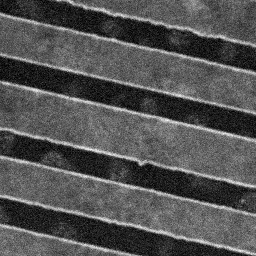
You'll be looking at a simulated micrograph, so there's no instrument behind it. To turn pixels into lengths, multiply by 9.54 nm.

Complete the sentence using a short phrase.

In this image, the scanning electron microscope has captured one or a few lines or trenches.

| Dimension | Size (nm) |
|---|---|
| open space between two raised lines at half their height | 258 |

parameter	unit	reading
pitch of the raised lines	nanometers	658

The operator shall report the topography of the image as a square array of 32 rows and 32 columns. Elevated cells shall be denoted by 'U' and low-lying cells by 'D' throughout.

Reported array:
DDDDDDDDDUUUUUUUUUUUUUUUUUUUUUUU
DDDDDDDDDDDDDUUUUUUUUUUUUUUUUUUU
UUUDDDDDDDDDDDDDDDUUUUUUUUUUUUUU
UUUUUUUDDDDDDDDDDDDDDDUUUUUUUUUU
UUUUUUUUUUUUDDDDDDDDDDDDDDUUUUUU
UUUUUUUUUUUUUUUUDDDDDDDDDDDDDDDU
UUUUUUUUUUUUUUUUUUUUUDDDDDDDDDDD
DDDUUUUUUUUUUUUUUUUUUUUUUDDDDDDD
DDDDDDDUUUUUUUUUUUUUUUUUUUUUUDDD
DDDDDDDDDDDDUUUUUUUUUUUUUUUUUUUU
UDDDDDDDDDDDDDDDUUUUUUUUUUUUUUUU
UUUUUUDDDDDDDDDDDDDDUUUUUUUUUUUU
UUUUUUUUUUDDDDDDDDDDDDDDDUUUUUUU
UUUUUUUUUUUUUUDDDDDDDDDDDDDDDUUU
UUUUUUUUUUUUUUUUUUUDDDDDDDDDDDDD
UUUUUUUUUUUUUUUUUUUUUUUDDDDDDDDD
DDUUUUUUUUUUUUUUUUUUUUUUUUUDDDDD
DDDDDDUUUUUUUUUUUUUUUUUUUUUUUUUU
DDDDDDDDDDUUUUUUUUUUUUUUUUUUUUUU
DDDDDDDDDDDDDDDUUUUUUUUUUUUUUUUU
UUUUDDDDDDDDDDDDDDDUUUUUUUUUUUUU
UUUUUUUUDDDDDDDDDDDDDDDDUUUUUUUU
UUUUUUUUUUUUUDDDDDDDDDDDDDDDUUUU
UUUUUUUUUUUUUUUUUDDDDDDDDDDDDDDD
UUUUUUUUUUUUUUUUUUUUUUDDDDDDDDDD
DDDDDUUUUUUUUUUUUUUUUUUUUUDDDDDD
DDDDDDDDDUUUUUUUUUUUUUUUUUUUUUDD
DDDDDDDDDDDDDUUUUUUUUUUUUUUUUUUU
UUDDDDDDDDDDDDDDDDUUUUUUUUUUUUUU
UUUUUUDDDDDDDDDDDDDDDDUUUUUUUUUU
UUUUUUUUUUDDDDDDDDDDDDDDDDUUUUUU
UUUUUUUUUUUUUUUDDDDDDDDDDDDDDDDU